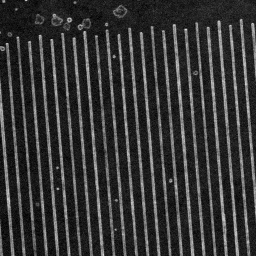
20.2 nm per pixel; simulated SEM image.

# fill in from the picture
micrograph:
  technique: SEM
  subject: parallel lines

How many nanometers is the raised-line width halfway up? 40.1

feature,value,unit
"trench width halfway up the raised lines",186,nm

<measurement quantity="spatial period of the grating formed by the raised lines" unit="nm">226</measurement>